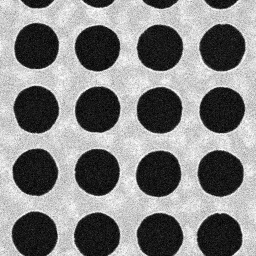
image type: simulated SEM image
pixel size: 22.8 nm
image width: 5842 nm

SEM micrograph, a regular array of holes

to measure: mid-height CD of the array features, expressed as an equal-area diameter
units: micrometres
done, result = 1.07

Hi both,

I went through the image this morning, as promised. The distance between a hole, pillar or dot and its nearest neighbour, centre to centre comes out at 1410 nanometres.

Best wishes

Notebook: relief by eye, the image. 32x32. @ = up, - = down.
@@@---@@@@@---@@@@----@@@@---@@@
@@@@@@@@@@@@@@@@@@@@@@@@@@@@@@@@
@@@@@@@@@@@@@@@@@@@@@@@@@@@@@@@@
@@@---@@@@@---@@@@----@@@@---@@@
@@-----@@@-----@@------@@-----@@
@@-----@@------@@------@@------@
@@-----@@------@@------@@------@
@@-----@@@-----@@-----@@@-----@@
@@@---@@@@@---@@@@---@@@@@---@@@
@@@@@@@@@@@@@@@@@@@@@@@@@@@@@@@@
@@@@@@@@@@@@@@@@@@@@@@@@@@@@@@@@
@@----@@@@----@@@@----@@@@----@@
@@-----@@@-----@@------@@-----@@
@@-----@@------@@------@@------@
@@-----@@------@@------@@------@
@@-----@@@-----@@@----@@@-----@@
@@@---@@@@@--@@@@@@--@@@@@@--@@@
@@@@@@@@@@@@@@@@@@@@@@@@@@@@@@@@
@@@@@@@@@@@@@@@@@@@@@@@@@@@@@@@@
@@-----@@@----@@@@----@@@@---@@@
@@-----@@------@@-----@@@-----@@
@@-----@@------@@------@@------@
@@-----@@------@@------@@-----@@
@@-----@@@----@@@-----@@@-----@@
@@@@-@@@@@@@-@@@@@@--@@@@@@-@@@@
@@@@@@@@@@@@@@@@@@@@@@@@@@@@@@@@
@@@@-@@@@@@@@@@@@@@@@@@@@@@@@@@@
@@-----@@@----@@@@----@@@@---@@@
@@-----@@------@@------@@-----@@
@------@@------@@------@@-----@@
@@-----@@------@@------@@-----@@
@@----@@@@----@@@@----@@@-----@@